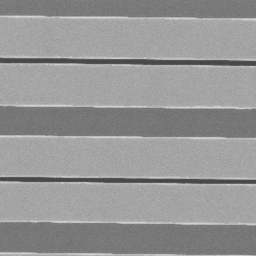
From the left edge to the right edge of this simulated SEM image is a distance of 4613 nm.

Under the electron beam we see lines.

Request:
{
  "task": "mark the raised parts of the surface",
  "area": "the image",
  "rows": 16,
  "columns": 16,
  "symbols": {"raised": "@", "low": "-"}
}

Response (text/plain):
----------------
@@@@@@@@@@@@@@@@
@@@@@@@@@@@@@@@@
@@@@@@@@@@@@@@@@
@@@@@@@@@@@@@@@@
@@@@@@@@@@@@@@@@
@@@@@@@@@@@@@@@@
----------------
----------------
@@@@@@@@@@@@@@@@
@@@@@@@@@@@@@@@@
@@@@@@@@@@@@@@@@
@@@@@@@@@@@@@@@@
@@@@@@@@@@@@@@@@
----------------
----------------